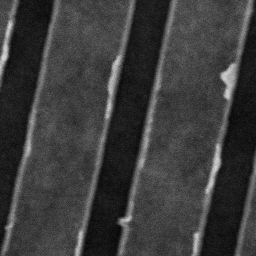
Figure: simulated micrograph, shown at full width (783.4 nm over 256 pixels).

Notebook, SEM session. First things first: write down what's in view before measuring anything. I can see one or a few lines or trenches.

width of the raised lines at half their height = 236 nm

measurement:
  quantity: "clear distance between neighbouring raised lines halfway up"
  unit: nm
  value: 117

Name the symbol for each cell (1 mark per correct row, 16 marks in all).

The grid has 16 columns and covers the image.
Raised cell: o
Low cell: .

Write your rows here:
o..ooooo...ooooo
o..ooooo..ooooo.
o..ooooo..ooooo.
...ooooo..ooooo.
...oooo...ooooo.
..ooooo...ooooo.
..ooooo..ooooo..
..ooooo..ooooo..
..ooooo..ooooo..
..oooo...ooooo..
.ooooo...ooooo..
.ooooo..ooooo...
.ooooo..ooooo...
.oooo...ooooo..o
ooooo...ooooo..o
ooooo..ooooo...o